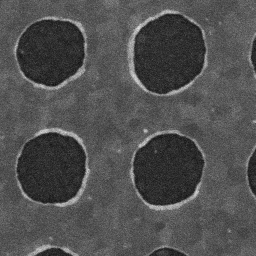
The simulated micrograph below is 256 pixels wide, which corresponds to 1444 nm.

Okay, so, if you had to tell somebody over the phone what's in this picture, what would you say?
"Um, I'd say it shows holes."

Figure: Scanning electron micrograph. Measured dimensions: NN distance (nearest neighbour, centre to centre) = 654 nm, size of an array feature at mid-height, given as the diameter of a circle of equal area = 408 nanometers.